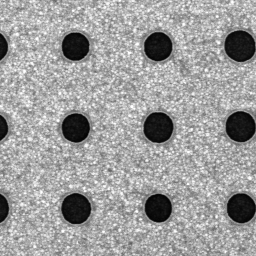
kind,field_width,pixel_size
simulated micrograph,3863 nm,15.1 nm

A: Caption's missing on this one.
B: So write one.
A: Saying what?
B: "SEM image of holes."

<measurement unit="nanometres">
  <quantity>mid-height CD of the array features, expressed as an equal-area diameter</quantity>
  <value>439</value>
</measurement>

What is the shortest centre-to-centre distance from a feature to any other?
1.22 um